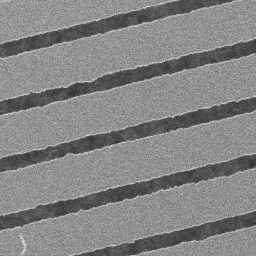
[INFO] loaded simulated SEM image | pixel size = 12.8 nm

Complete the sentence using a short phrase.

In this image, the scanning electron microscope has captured parallel lines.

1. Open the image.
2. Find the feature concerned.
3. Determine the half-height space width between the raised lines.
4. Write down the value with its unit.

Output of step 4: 192 nm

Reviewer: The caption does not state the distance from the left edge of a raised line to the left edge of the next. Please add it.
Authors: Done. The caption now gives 55.6 px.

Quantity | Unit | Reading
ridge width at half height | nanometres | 523